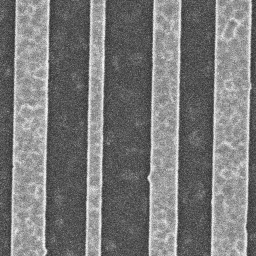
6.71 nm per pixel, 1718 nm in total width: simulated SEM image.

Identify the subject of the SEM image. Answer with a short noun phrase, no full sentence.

one or a few lines or trenches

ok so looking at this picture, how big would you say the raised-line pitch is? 450 nanometres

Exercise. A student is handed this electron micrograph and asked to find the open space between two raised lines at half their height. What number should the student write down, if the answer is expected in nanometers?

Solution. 284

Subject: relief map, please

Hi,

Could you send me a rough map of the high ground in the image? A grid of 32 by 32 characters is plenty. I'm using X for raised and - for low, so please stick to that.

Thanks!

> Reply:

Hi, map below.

--XXXX-----XX------XXX-----XXXX-
--XXXX-----XX------XXX-----XXXX-
--XXXX-----XX------XXX-----XXXX-
--XXXX-----XX------XXX-----XXXX-
--XXXX-----XX------XXX-----XXXX-
--XXXX-----XX------XXX-----XXXX-
--XXXX-----XX------XXX-----XXXX-
--XXXX-----XX------XXX-----XXXX-
--XXXX-----XX------XXX-----XXXX-
--XXXX-----XX------XXX-----XXXX-
--XXXX-----XX------XXX-----XXXX-
--XXXX-----XX------XXX-----XXXX-
--XXXX-----XX------XXX-----XXXX-
--XXXX-----XX------XXX-----XXXX-
--XXXX-----XX------XXX-----XXXX-
--XXXX-----XX------XXX-----XXXX-
--XXXX-----XX------XXX-----XXXX-
--XXXX-----XX------XXX-----XXXX-
--XXXX-----XX------XXX-----XXXX-
--XXXX-----XX------XXX-----XXXX-
--XXXX-----XX------XXX-----XXXX-
--XXXX-----XX------XXX-----XXXX-
--XXXX-----XX------XXX-----XXXX-
--XXXX-----XX------XXX-----XXXX-
--XXXX-----XX------XXX-----XXXX-
--XXXX-----XX------XXX-----XXXX-
--XXXX-----X-------XXX-----XXXX-
--XXXX-----X-------XXX-----XXXX-
--XXXX-----XX------XXX-----XXXX-
--XXXX-----XX------XXX-----XXXX-
--XXXX-----XX------XXX----XXXXX-
--XXXX-----XX------XXX----XXXXX-